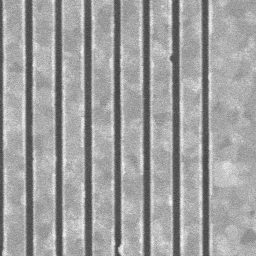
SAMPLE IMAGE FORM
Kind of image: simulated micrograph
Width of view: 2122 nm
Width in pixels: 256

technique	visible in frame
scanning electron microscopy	parallel lines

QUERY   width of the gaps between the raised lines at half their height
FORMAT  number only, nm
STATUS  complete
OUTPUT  70.4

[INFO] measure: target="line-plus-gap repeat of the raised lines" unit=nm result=244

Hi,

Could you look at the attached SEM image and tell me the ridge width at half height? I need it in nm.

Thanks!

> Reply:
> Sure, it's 170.